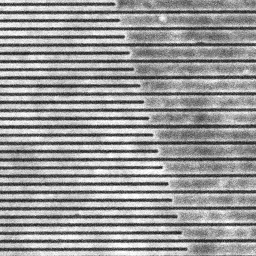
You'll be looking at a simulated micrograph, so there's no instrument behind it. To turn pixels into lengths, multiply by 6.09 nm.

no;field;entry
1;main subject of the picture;parallel lines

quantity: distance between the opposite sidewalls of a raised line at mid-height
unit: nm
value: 23.6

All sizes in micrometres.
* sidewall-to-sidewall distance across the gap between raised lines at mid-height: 0.0236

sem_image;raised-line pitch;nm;49.8